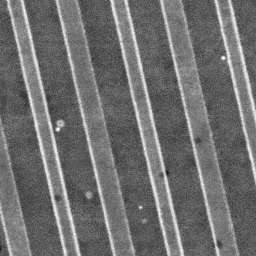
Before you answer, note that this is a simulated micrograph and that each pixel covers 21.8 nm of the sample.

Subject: lines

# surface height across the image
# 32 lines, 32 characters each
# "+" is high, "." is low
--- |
.++....+++....++....+++....++...
.++....+++....++....+++....++...
.++.....++....++.....++....++...
..++....++.....++....++.....++..
..++....+++....++....+++....++..
..++....+++....++....+++....++..
..++.....++....++.....++....++..
...++....++.....+.....++.....+..
...++....+++....++....+++....++.
...++....+++....++....+++....++.
...++....+++....++....+++....++.
....+.....++....++.....++....++.
....++....++.....++....++.....++
....++....+++....++....+++....++
....++....+++....++....+++....++
....++.....++....++.....++....++
.....+.....++.....+.....++.....+
+....++....+++....++....+++....+
+....++....+++....++....+++....+
+....++....+++....++....+++....+
+.....+.....++....++.....++.....
+.....++....++.....++....++.....
++....++....+++....++....+++....
++....++....+++....++....+++....
++....++.....++....++.....++....
++.....+.....++.....+.....++....
+++....++....+++....++....+++...
+++....++....+++....++....+++...
.++....++....+++....++.....++...
.++.....+.....++.....+.....++...
.+++....++....++.....++....++...
.+++....++....+++....++....+++..